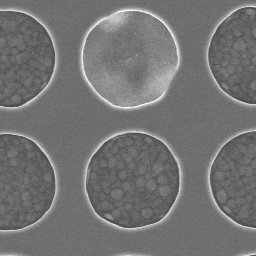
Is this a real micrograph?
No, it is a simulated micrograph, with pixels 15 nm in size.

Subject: holes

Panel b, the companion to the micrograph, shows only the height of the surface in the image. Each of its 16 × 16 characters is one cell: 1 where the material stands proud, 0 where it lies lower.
1111111111111110
0001111111111100
0001111111111000
0001111111111000
0001111111111000
0001111111111100
0011111111111111
1111111111111111
0111111001111110
0001110000011100
0001100000011000
0001100000011000
0001110000011000
0001110000111100
1111111111111111
1111111111111111